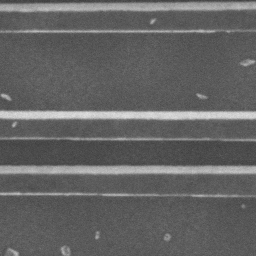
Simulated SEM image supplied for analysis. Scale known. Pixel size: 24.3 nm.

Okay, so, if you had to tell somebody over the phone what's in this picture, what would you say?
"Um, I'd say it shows lines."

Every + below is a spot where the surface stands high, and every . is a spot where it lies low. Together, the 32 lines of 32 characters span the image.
................................
++++++++++++++++++++++++++++++++
++++++++++++++++++++++++++++++++
++++++++++++++++++++++++++++++++
................................
................................
................................
................................
................................
................................
................................
................................
................................
................................
++++++++++++++++++++++++++++++++
++++++++++++++++++++++++++++++++
++++++++++++++++++++++++++++++++
.............................+++
................................
................................
................................
++++++++++++++++++++++++++++++++
++++++++++++++++++++++++++++++++
++++++++++++++++++++++++++++++++
................................
................................
................................
................................
................................
................................
................................
................................